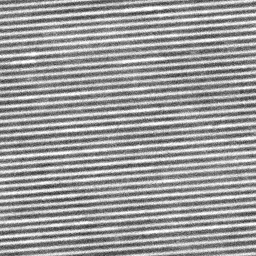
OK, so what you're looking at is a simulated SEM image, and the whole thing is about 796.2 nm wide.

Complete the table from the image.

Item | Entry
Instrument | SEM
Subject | parallel lines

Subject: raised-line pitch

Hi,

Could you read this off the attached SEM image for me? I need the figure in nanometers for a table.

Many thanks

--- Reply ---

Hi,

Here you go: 22.4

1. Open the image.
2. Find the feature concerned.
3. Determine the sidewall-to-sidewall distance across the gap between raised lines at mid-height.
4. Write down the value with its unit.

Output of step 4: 16.3 nanometres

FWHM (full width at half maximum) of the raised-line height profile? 0.0046 um